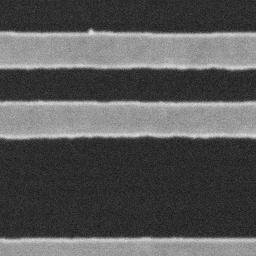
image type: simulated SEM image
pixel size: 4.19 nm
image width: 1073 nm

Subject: lines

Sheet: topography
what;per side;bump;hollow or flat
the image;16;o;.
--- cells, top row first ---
................
................
oooooooooooooooo
oooooooooooooooo
................
................
oooooooooooooooo
oooooooooooooooo
ooooooooo.o.oooo
................
................
................
................
................
................
oooooooooooooooo